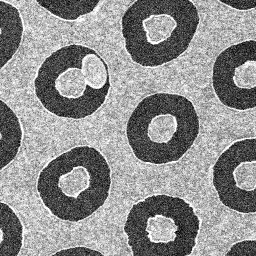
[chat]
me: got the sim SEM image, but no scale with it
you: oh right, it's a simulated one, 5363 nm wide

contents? ring-shaped grooves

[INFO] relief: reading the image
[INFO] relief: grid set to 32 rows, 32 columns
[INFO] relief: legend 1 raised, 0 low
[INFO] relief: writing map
01111000000011110000000011110000
00111100000111110000000001111111
00011111011111100011110001111111
00011111111111100011110001111111
00011111111111100001100011111111
00011111111111110000000011111000
00111110000011110000000111110000
01111100000101111000001111100000
11111000001110111111111111100011
11111000111110111111111111100111
11110001111110111111111111100011
11110000110000111111111111100000
11111000000001111100000011100000
01111100000011111000000011111000
00111110000111110000100001111111
00011111111111110001110001111111
00011111111111110011110001111111
00011111111111110001100011111100
00111111100011110000000011110000
00111110000001111000000111100000
01111100000000111110111111100011
11111000011000111111111111100111
11111001111000111111111111100011
11111000111000111111111111100011
11111000000000111110011111100000
01111000000001111000000011110000
00111100000011110000000011111100
00111111001111110001100001111111
00011111111111100011110001111111
00011111111111110001110001111111
00011111111111110000000011111000
00111110000011111000000011110000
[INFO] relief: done